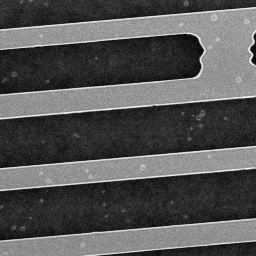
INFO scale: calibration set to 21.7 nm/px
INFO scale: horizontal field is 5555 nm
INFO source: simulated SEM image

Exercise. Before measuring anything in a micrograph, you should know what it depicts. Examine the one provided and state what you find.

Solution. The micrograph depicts one or a few lines or trenches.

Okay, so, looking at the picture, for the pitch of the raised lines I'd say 1520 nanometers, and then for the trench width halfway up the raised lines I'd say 1.08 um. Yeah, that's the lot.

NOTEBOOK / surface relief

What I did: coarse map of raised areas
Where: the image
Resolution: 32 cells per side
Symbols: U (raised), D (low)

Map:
DDDDDDDDDDDDDDDDDDDDDDDDDDDDDDDD
DDDDDDDDDDDDDDDDDDDDDDDDDDUUUUUU
DDDDDDDDDDDDDDDUUUUUUUUUUUUUUUUU
DDDUUUUUUUUUUUUUUUUUUUUUUUUUUUUU
UUUUUUUUUUUUUUUUUUDDDDDDUUUUUUUU
UUUUUUUUDDDDDDDDDDDDDDDDDUUUUUUU
DDDDDDDDDDDDDDDDDDDDDDDDDUUUUUUD
DDDDDDDDDDDDDDDDDDDDDDDDDUUUUUUD
DDDDDDDDDDDDDDDDDDDDDDDDDUUUUUUU
DDDDDDDDDDDDDDDDDDDDDDDDDUUUUUUU
DDDDDDDDDDDDDDDDDUUUUUUUUUUUUUUU
DDDDUUUUUUUUUUUUUUUUUUUUUUUUUUUU
UUUUUUUUUUUUUUUUUUUUUUUUUUUDDDDD
UUUUUUUUUUUUUUUDDDDDDDDDDDDDDDDD
UUUUDDDDDDDDDDDDDDDDDDDDDDDDDDDD
DDDDDDDDDDDDDDDDDDDDDDDDDDDDDDDD
DDDDDDDDDDDDDDDDDDDDDDDDDDDDDDDD
DDDDDDDDDDDDDDDDDDDDDDDDDDDDDDDD
DDDDDDDDDDDDDDDDDDDDDDDDDDDDDDUU
DDDDDDDDDDDDDDDDDDDUUUUUUUUUUUUU
DDDDDDDUUUUUUUUUUUUUUUUUUUUUUUUU
UUUUUUUUUUUUUUUUUUUUUUUUUUDDDDDD
UUUUUUUUUUUUUUUDDDDDDDDDDDDDDDDD
UUUDDDDDDDDDDDDDDDDDDDDDDDDDDDDD
DDDDDDDDDDDDDDDDDDDDDDDDDDDDDDDD
DDDDDDDDDDDDDDDDDDDDDDDDDDDDDDDD
DDDDDDDDDDDDDDDDDDDDDDDDDDDDDDDD
DDDDDDDDDDDDDDDDDDDDDDDDDDDDDDDU
DDDDDDDDDDDDDDDDDDDUUUUUUUUUUUUU
DDDDDDDDUUUUUUUUUUUUUUUUUUUUUUUU
UUUUUUUUUUUUUUUUUUUUUUUUUUUDDDDD
UUUUUUUUUUUUUUUUUDDDDDDDDDDDDDDD